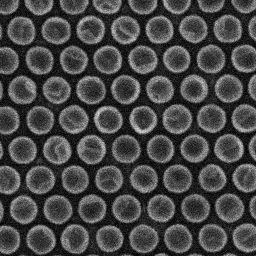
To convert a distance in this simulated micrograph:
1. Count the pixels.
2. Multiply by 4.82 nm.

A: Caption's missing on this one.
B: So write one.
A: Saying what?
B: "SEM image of a regular array of raised bodies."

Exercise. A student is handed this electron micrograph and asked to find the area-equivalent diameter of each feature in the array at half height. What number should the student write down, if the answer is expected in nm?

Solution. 131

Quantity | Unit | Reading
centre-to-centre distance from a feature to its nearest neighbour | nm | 164